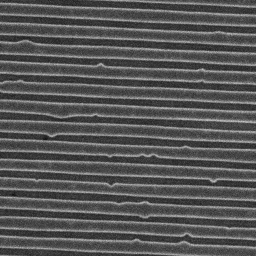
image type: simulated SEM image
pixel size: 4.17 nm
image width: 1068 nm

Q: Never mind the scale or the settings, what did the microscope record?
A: parallel lines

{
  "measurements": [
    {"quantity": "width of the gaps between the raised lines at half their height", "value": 7.75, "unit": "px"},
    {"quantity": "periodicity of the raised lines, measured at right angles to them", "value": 19.3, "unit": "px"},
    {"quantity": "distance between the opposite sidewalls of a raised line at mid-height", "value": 47.4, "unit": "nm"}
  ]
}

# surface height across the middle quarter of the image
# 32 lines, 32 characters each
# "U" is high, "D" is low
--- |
UUUUUUDDUUDDDDDDDDDDDDDDDDDDDDDD
UUUUUUUUUUUUUUUUUUUUUUUUUUUUUUUD
UUUUUUUUUUUUUUUUUUUUUUUUUUUUUUUU
DDDDDDDDDDDDDUUUUUUUUUUUUUUUUUUU
DDDDDDDDDDDDDDDDDDDDDDDDDDDDDDDD
UUUUUUUUUDDDDDDDDDDDDDDDDDDDDDDD
UUUUUUUUUUUUUUUUUUUUUUUUUUUUUUUU
UUUUUUUUUUUUUUUUUUUUUUUUUUUUUUUU
DDDDDDDDDDDDDDDDDDUUUUUUUUUUUUUU
DDDDDDDDDDDDDDDDDDDDDDDDDDDDDDDD
UUUUUUUUUUUUUUDDDDDDDDDDDDDDDDDD
UUUUUUUUUUUUUUUUUUUUUUUUUUUUUUUU
UUUUUUUUUUUUUUUUUUUUUUUUUUUUUUUU
DDDDDDDDDDDDDDDDDDDDDDDUUUUUUUUU
DDDDDDDDDDDDDDDDDDDDDDDDDDDDDDDD
UUUUUUUUUUUUUUUUUUUDDDDDDDDDDDDD
UUUUUUUUUUUUUUUUUUUUUUUUUUUUUUUU
DUUUUUUUUUUUUUUUUUUUUUUUUUUUUUUU
DDDDDDDDDDDDDDDDDDDDDDDUUUUUUUUU
UDDDDDDDDDDDDDDDDDDDDDDDDDDDDDDD
UUUUUUUUUUUUUUUUUUUDDDDDDDDDDDDD
UUUUUUUUUUUUUUUUUUUUUUUUUUUUUUUU
DDDDDDUUUUUUUUUUUUUUUUUUUUUUUUUU
DDDDDDDDDDDDDDDDDDDDDDDDDDDDUUUU
UUDDUUUDDDDDDDDDDDDDDDDDDDDDDDDD
UUUUUUUUUUUUUUUUUUUUUUUUDDDDDDDD
UUUUUUUUUUUUUUUUUUUUUUUUUUUUUUUU
DDDDDDUUUUUUUUUUUUUUUUUUUUUUUUUU
DDDDDDDDDDDDDDDDDDDDDDDDDDDDDDDD
UUUUDDDDDDDDDDDDDDDDDDDDDDDDDDDD
UUUUUUUUUUUUUUUUUUUUUUUUUUUUUDUU
UUUUUUUUUUUUUUUUUUUUUUUUUUUUUUUU